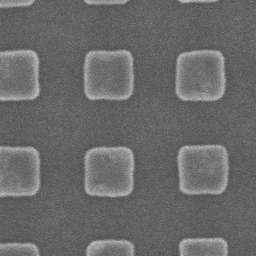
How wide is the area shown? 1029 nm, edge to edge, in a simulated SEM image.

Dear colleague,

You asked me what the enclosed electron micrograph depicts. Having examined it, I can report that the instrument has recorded raised bodies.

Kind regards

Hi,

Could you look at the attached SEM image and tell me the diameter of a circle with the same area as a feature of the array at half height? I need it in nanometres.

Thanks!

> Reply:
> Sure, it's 213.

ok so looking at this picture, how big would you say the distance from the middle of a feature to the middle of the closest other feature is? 371 nm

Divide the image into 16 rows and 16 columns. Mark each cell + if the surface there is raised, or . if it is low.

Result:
................
................
................
++....++...+++..
++...+++...+++..
++...+++...+++..
................
................
................
++....++...+++..
++...+++...+++..
++...+++...+++..
................
................
................
++....++...+++..